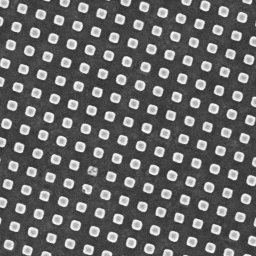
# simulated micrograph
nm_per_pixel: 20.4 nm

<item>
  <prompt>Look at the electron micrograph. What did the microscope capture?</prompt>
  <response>a regular array of raised bodies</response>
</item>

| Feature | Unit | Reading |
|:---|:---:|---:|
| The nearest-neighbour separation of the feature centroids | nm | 387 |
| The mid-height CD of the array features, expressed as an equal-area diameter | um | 0.203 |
